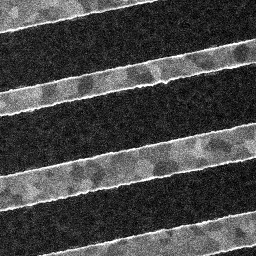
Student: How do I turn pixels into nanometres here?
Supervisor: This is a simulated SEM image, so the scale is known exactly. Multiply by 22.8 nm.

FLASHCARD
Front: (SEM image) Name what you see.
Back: one or a few lines or trenches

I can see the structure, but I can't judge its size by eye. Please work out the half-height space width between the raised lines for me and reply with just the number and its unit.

1240 nm